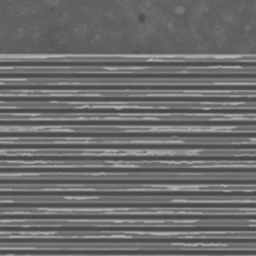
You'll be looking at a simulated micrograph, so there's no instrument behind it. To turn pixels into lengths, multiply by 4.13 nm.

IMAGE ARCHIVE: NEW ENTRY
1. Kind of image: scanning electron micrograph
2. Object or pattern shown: parallel lines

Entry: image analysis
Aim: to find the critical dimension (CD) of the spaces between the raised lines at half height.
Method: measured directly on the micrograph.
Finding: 20.1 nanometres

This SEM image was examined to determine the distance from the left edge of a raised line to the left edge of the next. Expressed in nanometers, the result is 48.7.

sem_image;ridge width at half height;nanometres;27.9